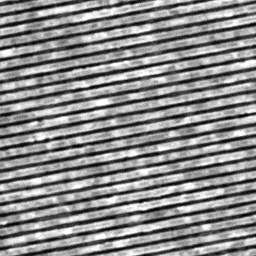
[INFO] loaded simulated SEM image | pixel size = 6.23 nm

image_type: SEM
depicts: parallel lines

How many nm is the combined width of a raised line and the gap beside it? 68.1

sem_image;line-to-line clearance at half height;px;5.17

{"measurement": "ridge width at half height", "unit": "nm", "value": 37.6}